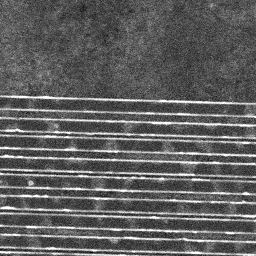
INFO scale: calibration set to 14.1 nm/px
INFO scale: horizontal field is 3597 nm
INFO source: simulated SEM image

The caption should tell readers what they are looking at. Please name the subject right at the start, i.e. parallel lines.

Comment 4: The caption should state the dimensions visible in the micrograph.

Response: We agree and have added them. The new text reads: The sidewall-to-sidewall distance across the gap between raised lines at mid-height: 98.3 nanometers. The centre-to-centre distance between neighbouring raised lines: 277 nanometers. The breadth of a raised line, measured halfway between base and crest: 195 nanometers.